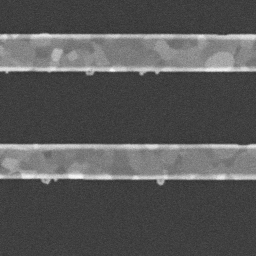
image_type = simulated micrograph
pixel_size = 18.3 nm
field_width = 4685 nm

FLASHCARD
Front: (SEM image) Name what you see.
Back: lines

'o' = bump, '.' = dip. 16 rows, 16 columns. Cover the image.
................
................
oooooooooooooooo
oooooooooooooooo
................
................
................
................
................
oooooooooooooooo
oooooooooooooooo
................
................
................
................
................